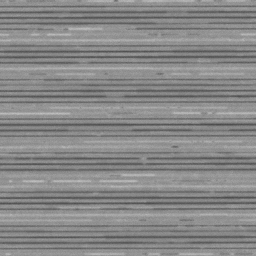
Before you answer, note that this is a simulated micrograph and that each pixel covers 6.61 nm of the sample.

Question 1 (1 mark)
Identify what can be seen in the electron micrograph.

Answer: parallel lines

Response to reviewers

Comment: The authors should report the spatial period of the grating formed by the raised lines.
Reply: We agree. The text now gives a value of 0.0372 µm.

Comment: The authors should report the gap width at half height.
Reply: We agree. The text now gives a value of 6.6 nanometres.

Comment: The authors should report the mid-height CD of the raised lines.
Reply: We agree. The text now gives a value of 0.0297 microns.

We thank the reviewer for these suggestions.